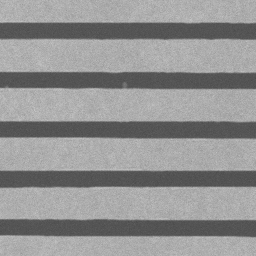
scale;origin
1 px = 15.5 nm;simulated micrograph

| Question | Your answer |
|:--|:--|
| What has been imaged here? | lines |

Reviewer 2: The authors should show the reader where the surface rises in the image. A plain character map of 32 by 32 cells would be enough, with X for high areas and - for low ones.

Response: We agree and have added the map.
XXXXXXXXXXXXXXXXXXXXXXXXXXXXXXXX
XXXXXXXXXXXXXXXXXXXXXXXXXXXXXXXX
XXXXXXXXXXXXXXXXXXXXXXXXXXXXXXXX
--------------------------------
--------------------------------
XXXXXXXXXXXXXXXXXXXXXXXXXXXXXXXX
XXXXXXXXXXXXXXXXXXXXXXXXXXXXXXXX
XXXXXXXXXXXXXXXXXXXXXXXXXXXXXXXX
XXXXXXXXXXXXXXXXXXXXXXXXXXXXXXXX
--------------------------------
--------------------------------
XXXXXXXXXXXXXXXXXXXXXXXXXXXXXXXX
XXXXXXXXXXXXXXXXXXXXXXXXXXXXXXXX
XXXXXXXXXXXXXXXXXXXXXXXXXXXXXXXX
XXXXXXXXXXXXXXXXXXXXXXXXXXXXXXXX
--------------------------------
--------------------------------
XXXXXXXXXXXXXXXXXXXXXXXXXXXXXXXX
XXXXXXXXXXXXXXXXXXXXXXXXXXXXXXXX
XXXXXXXXXXXXXXXXXXXXXXXXXXXXXXXX
XXXXXXXXXXXXXXXXXXXXXXXXXXXXXXXX
--------------------------------
--------------------------------
---XX-XXXX-XXXXXXXXXXXXXXXXXXXXX
XXXXXXXXXXXXXXXXXXXXXXXXXXXXXXXX
XXXXXXXXXXXXXXXXXXXXXXXXXXXXXXXX
XXXXXXXXXXXXXXXXXXXXXXXXXXXXXXXX
--------------------------------
--------------------------------
--------------------------------
XXXXXXXXXXXXXXXXXXXXXXXXXXXXXXXX
XXXXXXXXXXXXXXXXXXXXXXXXXXXXXXXX